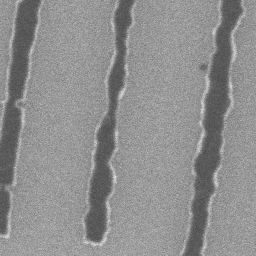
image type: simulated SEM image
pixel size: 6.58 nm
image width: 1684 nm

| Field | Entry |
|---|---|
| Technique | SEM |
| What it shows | one or a few lines or trenches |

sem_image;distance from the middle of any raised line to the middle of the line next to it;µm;0.666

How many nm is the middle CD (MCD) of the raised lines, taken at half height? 145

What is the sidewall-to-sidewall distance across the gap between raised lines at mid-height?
519 nanometres